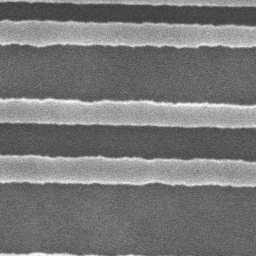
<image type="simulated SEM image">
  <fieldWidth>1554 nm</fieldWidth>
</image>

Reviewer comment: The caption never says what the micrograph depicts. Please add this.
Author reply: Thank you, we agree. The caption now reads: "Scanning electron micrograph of lines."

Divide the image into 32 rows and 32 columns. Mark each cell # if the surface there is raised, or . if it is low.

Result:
...................#############
................................
................................
################################
################################
#..####...######################
................................
................................
................................
................................
................................
................................
.##.............................
################################
################################
.......#########################
................................
................................
................................
................................
################################
################################
################################
................................
................................
................................
................................
................................
................................
................................
................................
................................